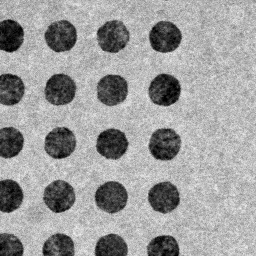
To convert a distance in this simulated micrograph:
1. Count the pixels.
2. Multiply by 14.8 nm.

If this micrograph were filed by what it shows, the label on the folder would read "a regular array of holes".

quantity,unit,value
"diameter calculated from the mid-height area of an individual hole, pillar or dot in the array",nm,486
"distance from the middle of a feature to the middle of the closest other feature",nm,768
